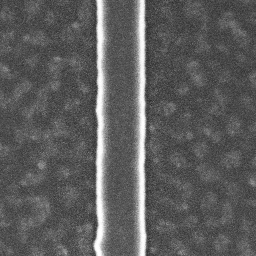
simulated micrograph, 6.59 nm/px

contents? one or a few lines or trenches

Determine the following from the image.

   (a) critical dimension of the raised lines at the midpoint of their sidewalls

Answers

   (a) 280 nm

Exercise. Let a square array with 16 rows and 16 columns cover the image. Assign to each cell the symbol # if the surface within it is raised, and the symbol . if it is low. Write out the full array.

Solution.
......###.......
......###.......
......###.......
......###.......
......###.......
......###.......
......###.......
......###.......
......###.......
......###.......
......###.......
......###.......
......###.......
......###.......
......###.......
......###.......